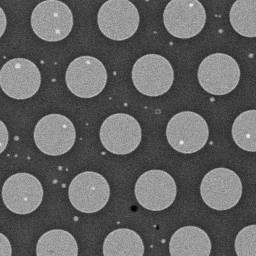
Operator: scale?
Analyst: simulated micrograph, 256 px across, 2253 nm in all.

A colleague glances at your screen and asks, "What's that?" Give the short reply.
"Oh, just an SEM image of an array of small figures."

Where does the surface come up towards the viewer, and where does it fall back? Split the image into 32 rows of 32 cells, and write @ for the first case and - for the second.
-----@@@-----@@@@----@@@@----@@@
----@@@@@---@@@@@----@@@@@---@@@
@---@@@@@---@@@@@----@@@@@---@@@
@---@@@@@----@@@@----@@@@----@@@
-----@@@-----@@@------@@-------@
--------------------------------
--------------------------------
-@@------@@@-----@@@@-----@@@---
@@@@@---@@@@@----@@@@----@@@@@--
@@@@@---@@@@@----@@@@@---@@@@@--
@@@@@---@@@@@----@@@@----@@@@@--
-@@@-----@@@------@@@-----@@@---
--------------------------------
--------------------------------
------@@------@@------@@@-----@@
-----@@@@----@@@@----@@@@@---@@@
@---@@@@@----@@@@@---@@@@@---@@@
@---@@@@@----@@@@@---@@@@@---@@@
@----@@@@----@@@@-----@@@-----@@
--------------------------------
--------------------------------
------------------@@------@@@---
-@@@@----@@@@----@@@@@---@@@@@--
@@@@@----@@@@@---@@@@@---@@@@@--
@@@@@----@@@@@---@@@@@---@@@@@--
-@@@@----@@@@-----@@@-----@@@---
--@@-------@--------------------
--------------------------------
-----------------------@@------@
@----@@@@-----@@@-----@@@@----@@
@----@@@@@---@@@@@---@@@@@---@@@
@----@@@@@---@@@@@---@@@@@----@@